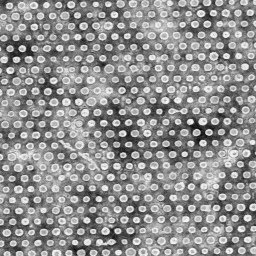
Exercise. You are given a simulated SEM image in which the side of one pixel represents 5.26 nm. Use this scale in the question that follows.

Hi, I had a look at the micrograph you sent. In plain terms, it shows a regular array of raised bodies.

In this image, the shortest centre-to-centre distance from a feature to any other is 63.4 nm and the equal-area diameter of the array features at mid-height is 33.6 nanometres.